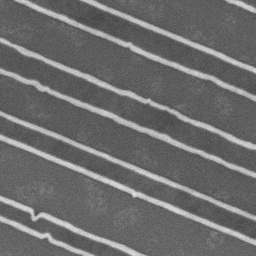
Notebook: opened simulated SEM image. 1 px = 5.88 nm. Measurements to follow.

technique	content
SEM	one or a few lines or trenches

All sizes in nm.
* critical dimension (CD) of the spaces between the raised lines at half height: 261